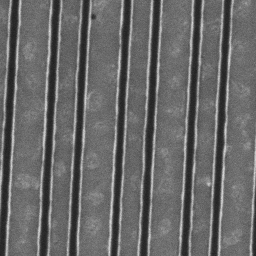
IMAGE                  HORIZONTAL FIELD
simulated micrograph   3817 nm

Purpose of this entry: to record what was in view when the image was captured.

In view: parallel lines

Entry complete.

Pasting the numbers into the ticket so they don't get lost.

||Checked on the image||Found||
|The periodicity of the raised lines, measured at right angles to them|521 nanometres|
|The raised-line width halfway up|147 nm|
